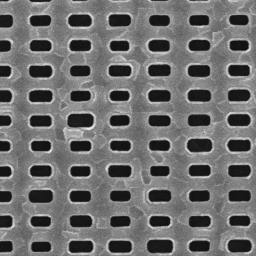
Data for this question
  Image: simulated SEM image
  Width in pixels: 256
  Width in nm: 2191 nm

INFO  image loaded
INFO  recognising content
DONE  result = a regular array of holes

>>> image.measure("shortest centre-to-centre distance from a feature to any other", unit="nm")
214